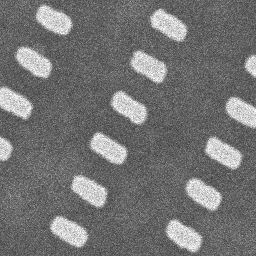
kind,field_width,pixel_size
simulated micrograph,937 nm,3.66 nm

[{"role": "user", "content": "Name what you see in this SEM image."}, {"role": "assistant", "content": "a regular array of raised bodies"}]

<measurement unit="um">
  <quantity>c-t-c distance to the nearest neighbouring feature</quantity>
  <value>0.167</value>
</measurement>